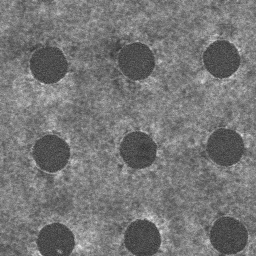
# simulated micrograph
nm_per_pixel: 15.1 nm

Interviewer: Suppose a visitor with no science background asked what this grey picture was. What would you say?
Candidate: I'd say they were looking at holes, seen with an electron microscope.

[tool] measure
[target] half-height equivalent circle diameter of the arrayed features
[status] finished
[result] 586 nm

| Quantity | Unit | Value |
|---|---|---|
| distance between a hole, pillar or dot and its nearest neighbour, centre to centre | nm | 1310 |